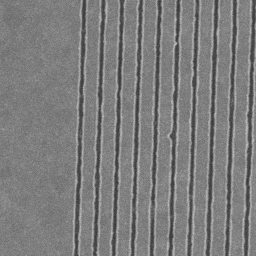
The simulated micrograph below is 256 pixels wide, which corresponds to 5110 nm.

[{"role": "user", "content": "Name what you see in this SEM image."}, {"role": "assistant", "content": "parallel lines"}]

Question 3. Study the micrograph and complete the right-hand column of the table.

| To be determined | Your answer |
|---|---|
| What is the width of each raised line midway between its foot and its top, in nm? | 284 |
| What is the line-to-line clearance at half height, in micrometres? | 0.0997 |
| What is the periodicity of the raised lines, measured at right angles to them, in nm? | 376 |